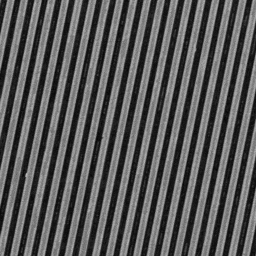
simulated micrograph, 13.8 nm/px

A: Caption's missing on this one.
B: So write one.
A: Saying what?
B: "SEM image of parallel lines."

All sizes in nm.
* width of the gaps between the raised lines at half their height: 113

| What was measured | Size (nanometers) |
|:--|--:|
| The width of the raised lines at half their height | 75.9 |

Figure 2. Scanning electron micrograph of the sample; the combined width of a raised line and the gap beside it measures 0.184 µm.